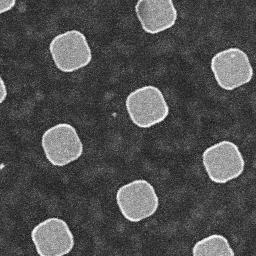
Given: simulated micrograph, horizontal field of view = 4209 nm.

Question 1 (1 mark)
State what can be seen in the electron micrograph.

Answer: raised bodies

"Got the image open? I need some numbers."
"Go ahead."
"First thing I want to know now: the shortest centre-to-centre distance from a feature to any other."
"1530 nm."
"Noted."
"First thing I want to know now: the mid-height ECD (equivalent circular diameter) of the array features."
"642 nm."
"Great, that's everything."